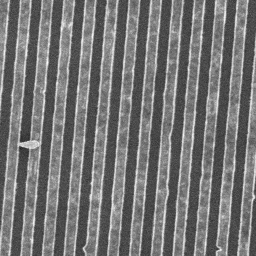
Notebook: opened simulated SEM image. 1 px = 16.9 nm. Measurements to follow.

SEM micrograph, parallel lines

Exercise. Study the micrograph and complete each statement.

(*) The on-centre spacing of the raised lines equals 365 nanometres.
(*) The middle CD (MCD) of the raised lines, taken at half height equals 181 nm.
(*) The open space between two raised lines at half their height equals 196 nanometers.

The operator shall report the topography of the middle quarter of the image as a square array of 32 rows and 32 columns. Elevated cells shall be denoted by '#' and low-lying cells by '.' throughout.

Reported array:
#...###..###...##...###...##...#
#...##...###...##...###...##...#
#...##...###...##...###...##...#
#...##...###...##...###...##...#
#...##...###...##...###...##...#
#...##...##....##...##....##...#
#...##...##...###...##...###...#
#..###...##...###...##...###...#
...###...##...###...##...###...#
...###...##...###...##...##....#
...###...##...###...##...###..##
...###...##...###..###...###..##
...###...##...##...###...##...##
...##...###...##...###...##...##
...##...###...##...###...##...##
...##...###...##...###..###...##
...##...###...##...###..###...##
...##...###...##...##...###...##
...##...###..###...##...##....##
..###...##...###...##...###...##
..###...##...###...##...###...##
..###...##...###...##...##....##
..###...##...###...##...##...###
..###..###...###..###...##...###
..##...###...##...###...##...###
..##...###...##...###...##...##.
..##...###...##...###...##...###
..##...###...##...###...##...##.
..##...###...##...##....##...##.
..##...##....##...##....##...##.
.###...##...###...##...###...##.
.###...##...###...##...###...##.